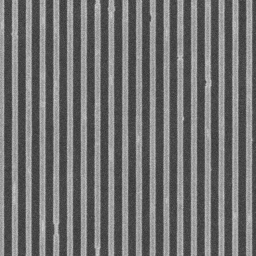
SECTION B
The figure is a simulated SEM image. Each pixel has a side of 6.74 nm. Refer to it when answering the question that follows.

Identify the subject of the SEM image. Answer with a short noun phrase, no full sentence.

parallel lines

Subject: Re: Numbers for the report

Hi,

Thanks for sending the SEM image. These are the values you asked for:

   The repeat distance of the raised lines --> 13.8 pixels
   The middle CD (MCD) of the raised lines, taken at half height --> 4.75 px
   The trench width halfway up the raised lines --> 57.3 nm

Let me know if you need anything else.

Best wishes